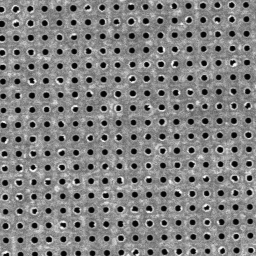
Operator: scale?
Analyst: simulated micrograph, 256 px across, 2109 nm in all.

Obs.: a regular array of holes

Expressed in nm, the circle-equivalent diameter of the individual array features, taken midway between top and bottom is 48.3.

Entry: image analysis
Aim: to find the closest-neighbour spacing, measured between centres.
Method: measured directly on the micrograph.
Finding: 116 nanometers